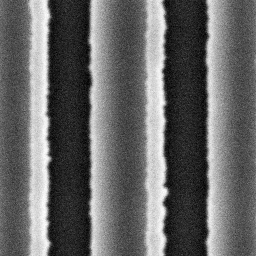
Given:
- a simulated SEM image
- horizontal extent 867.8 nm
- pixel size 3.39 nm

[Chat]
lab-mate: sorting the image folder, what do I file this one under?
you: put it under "lines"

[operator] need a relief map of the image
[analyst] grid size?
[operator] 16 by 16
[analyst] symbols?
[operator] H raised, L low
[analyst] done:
HHHLLLHHHHLLLHHH
HHHLLLHHHHLLLHHH
HHHLLLHHHHLLLHHH
HHHLLLHHHHLLLHHH
HHHLLLHHHHLLLHHH
HHHLLLHHHHLLLHHH
HHHLLLHHHHLLLHHH
HHHLLLHHHHLLLHHH
HHHLLLHHHHLLLHHH
HHHLLLHHHHLLLHHH
HHHLLLHHHHLLLHHH
HHHLLLHHHHLLLHHH
HHHLLLHHHHLLLHHH
HHHLLLHHHHLLLHHH
HHHLLLHHHHLLLHHH
HHHLLLHHHHLLLHHH